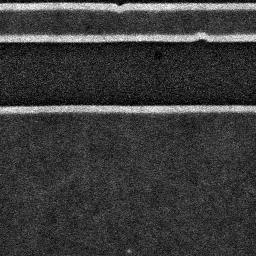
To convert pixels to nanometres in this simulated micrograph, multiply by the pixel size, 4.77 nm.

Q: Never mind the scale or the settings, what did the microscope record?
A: one or a few lines or trenches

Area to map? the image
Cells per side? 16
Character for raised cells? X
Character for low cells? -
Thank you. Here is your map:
XXXXXXXXXXXXXXXX
XXXXXXXXXXXXXXXX
----------------
----------------
----------------
----------------
----------------
XXXXXXXXXXXXXXXX
XXXXXXXXXXXXXXXX
XXXXXXXXXXXXXXXX
XXXXXXXXXXXXXXXX
XXXXXXXXXXXXXXXX
XXXXXXXXXXXXXXXX
XXXXXXXXXXXXXXXX
XXXXXXXXXXXXXXXX
XXXXXXXXXXXXXXXX